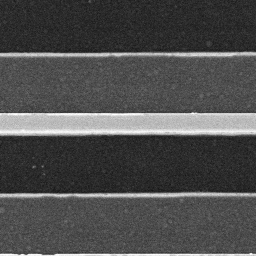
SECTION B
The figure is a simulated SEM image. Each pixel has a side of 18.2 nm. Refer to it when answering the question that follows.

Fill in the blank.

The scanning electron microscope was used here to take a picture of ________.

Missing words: lines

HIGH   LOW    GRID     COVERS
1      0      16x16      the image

0000000000000000
0000000000000000
0000000000000000
1111111111111111
1111111111111111
1111111111111111
1111111111111111
1111111111111111
0000000000000000
0000000000000000
0000000000000000
0000000000000000
1111111111111111
1111111111111111
1111111111111111
1111111111111111